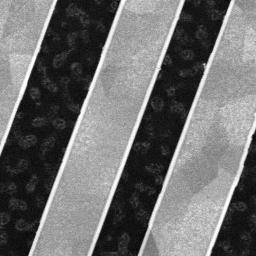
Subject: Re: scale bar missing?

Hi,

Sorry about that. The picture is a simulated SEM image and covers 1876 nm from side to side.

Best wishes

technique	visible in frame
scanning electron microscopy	one or a few lines or trenches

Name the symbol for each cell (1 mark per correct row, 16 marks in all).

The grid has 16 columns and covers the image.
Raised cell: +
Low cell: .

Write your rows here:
+++.....+++...++
+++....++++...++
+++....++++...++
++....++++...+++
++....++++...+++
+.....+++...++++
+....++++...++++
+....++++...++++
.....+++...+++++
....++++...++++.
....++++...++++.
...++++...+++++.
...++++...++++..
...++++...++++..
..++++...+++++..
..++++...++++...